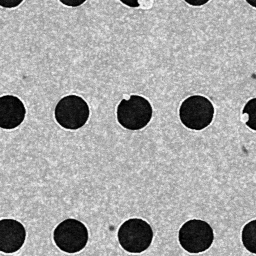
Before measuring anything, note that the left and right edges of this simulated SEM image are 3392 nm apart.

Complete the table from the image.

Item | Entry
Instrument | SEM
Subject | holes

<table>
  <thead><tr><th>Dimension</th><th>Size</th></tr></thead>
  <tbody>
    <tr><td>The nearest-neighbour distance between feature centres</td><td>824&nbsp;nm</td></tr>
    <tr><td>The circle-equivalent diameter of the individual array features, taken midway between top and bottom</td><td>464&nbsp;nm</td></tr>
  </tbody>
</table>